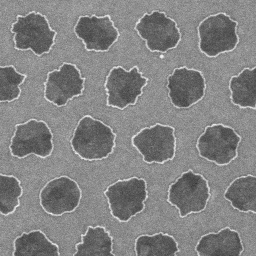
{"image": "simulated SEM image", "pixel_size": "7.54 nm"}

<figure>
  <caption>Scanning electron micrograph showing a regular array of raised bodies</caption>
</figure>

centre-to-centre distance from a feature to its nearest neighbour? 456 nm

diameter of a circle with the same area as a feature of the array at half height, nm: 307